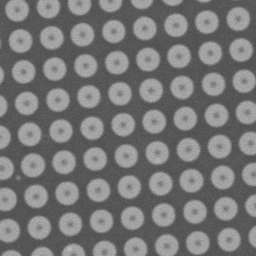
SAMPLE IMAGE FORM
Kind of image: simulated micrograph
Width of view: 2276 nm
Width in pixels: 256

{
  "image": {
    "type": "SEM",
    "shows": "an array of small figures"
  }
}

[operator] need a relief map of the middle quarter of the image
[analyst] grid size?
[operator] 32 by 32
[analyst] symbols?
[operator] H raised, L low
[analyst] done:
LLLHHHHHLLHHHHHHLLLHHHHLLLLHHHLL
LLLHHHHHLLLHHHHLLLLLHHLLLLLLLLLL
LLLHHHHLLLLLLLLLLLLLLLLLLLLLLLLL
LLLLLLLLLLLLLLLLLLLLLLLLLLLLHHHL
LLLLLLLLLLLLLLLLLLLLHHHHLLLHHHHH
LLLLLLHLLLLLHHHHLLLHHHHHLLLHHHHH
LLLLHHHHLLLHHHHHHLLHHHHHHLLHHHHH
HLLHHHHHHLLHHHHHHLLHHHHHHLLHHHHH
HLLHHHHHHLLHHHHHHLLLHHHHLLLLHHHL
HLLLHHHHHLLLHHHHLLLLLHLLLLLLLLLL
HLLLHHHHLLLLLLLLLLLLLLLLLLLLLLLL
LLLLLLLLLLLLLLLLLLLLLLLLLLLLHHHH
LLLLLLLLLLLLLLHHLLLLHHHHHLLLHHHH
LLLLLLHHLLLLHHHHHLLLHHHHHLLLHHHH
HLLLLHHHHLLLHHHHHHLLHHHHHLLLHHHH
HHLLHHHHHHLLHHHHHHLLHHHHHLLLHHHH
HHLLHHHHHHLLHHHHHLLLHHHHHLLLLLHL
HHLLLHHHHLLLLHHHLLLLLLLLLLLLLLLL
HHLLLLHHLLLLLLLLLLLLLLLLLLLLLLLL
LLLLLLLLLLLLLLLLLLLLLLHHLLLLLHHH
LLLLLLLLLLLLLLHHHLLLLHHHHHLLHHHH
LLLLLLHHHHLLLHHHHHLLLHHHHHLLHHHH
HHLLLHHHHHLLLHHHHHLLLHHHHHLLHHHH
HHHLLHHHHHHLLHHHHHLLLHHHHHLLLHHH
HHHLLHHHHHHLLHHHHHLLLLHHHLLLLLLL
HHHLLLHHHHLLLLHHHLLLLLLLLLLLLLLL
HHLLLLLHLLLLLLLLLLLLLLLLLLLLLLLH
LLLLLLLLLLLLLLLLLLLLLLHHHHLLLHHH
LLLLLLLLLLLLLLLHHHLLLLHHHHHLLHHH
LLLLLLLHHHHLLLHHHHHLLHHHHHHLLHHH
HHHLLLHHHHHLLLHHHHHLLHHHHHHLLHHH
HHHLLLHHHHHLLLHHHHHLLLHHHHHLLLHH